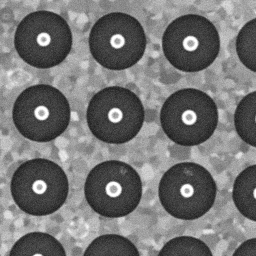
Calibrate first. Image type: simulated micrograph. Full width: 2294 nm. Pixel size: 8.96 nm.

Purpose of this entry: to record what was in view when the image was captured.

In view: an array of small figures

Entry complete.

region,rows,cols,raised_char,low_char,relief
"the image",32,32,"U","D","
UUUUUUUUUUUUUUUUUUUUUUUUUUUUUUUU
UUUUDDDUUUUUUUUUUUUUUUUUUUUUUUUU
UUUDDDDDUUUUDDDDDUUUUUDDDDUUUUUD
UUDDDDDDDUUDDDDDDDUUUDDDDDDUUUDD
UUDDDUDDDUUDDDDDDDUUDDDDDDDUUUDD
UUDDDUDDDUUDDDUDDDUUDDDUUDDDUDDD
UUDDDDDDDUUDDDDDDDUUDDDDDDDUUUDD
UUUDDDDDUUUUDDDDDDUUUDDDDDDUUUDD
UUUUUDUUUUUUUDDDUUUUUUDDDDUUUUUD
UUUUUUUUUUUUUUUUUUUUUUUUUUUUUUUU
UUUUUUUUUUUUUUUUUUUUUUUUUUUUUUUU
UUUDDDDDUUUUDDDDDUUUUUDDDUUUUUUU
UUDDDDDDUUUDDDDDDDUUUDDDDDDUUUDD
UUDDDDDDDUUDDDDDDDUUDDDDDDDUUUDD
UUDDDUDDDUUDDDUDDDUUDDDUDDDUUDDD
UUDDDDDDDUUDDDDDDDUUDDDDDDDUUDDD
UUDDDDDDUUUDDDDDDUUUDDDDDDDUUUDD
UUUUDDDUUUUUDDDDUUUUUDDDDDUUUUDD
UUUUUUUUUUUUUUUUUUUUUUUUUUUUUUUU
UUUUUUUUUUUUUUUUUUUUUUUUUUUUUUUU
UUUDDDDUUUUUDDDDUUUUUUDDDUUUUUUU
UUDDDDDDUUUDDDDDDUUUUDDDDDUUUUDD
UDDDDDDDUUUDDDDDDDUUDDDDDDDUUDDD
UDDDUUDDDUUDDUUDDDUUDDDUDDDUUDDD
UUDDDDDDUUUDDDDDDDUUDDDDDDDUUDDD
UUDDDDDDUUUDDDDDDUUUDDDDDDDUUDDD
UUUDDDDUUUUUDDDDDUUUUDDDDDUUUUDD
UUUUUUUUUUUUUUUUUUUUUUUDUUUUUUUD
UUUUUUUUUUUUUUUUUUUUUUUUUUUUUUUU
UUUDDDDUUUUUDDDUUUUUUUUDUUUUUUUU
UUDDDDDDUUUDDDDDDUUUUDDDDDUUUUDD
UDDDDDDDUUUDDDDDDUUUDDDDDDUUUDDD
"